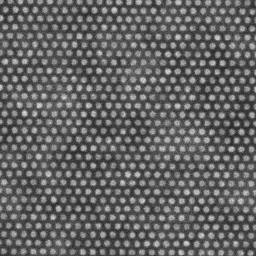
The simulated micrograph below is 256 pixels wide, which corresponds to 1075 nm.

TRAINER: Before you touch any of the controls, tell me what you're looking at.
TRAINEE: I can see a regular array of raised bodies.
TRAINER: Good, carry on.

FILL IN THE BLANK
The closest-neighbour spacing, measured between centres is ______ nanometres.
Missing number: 39.9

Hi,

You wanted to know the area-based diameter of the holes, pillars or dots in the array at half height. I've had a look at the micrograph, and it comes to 22.2 nm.